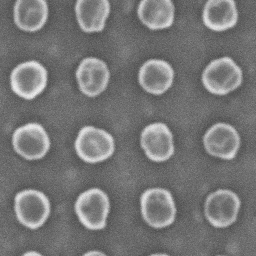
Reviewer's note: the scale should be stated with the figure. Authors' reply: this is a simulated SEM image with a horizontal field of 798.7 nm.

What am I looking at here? a regular array of raised bodies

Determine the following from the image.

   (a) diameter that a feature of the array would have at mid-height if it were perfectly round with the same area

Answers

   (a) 33.6 px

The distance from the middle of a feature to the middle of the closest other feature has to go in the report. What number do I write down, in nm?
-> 196